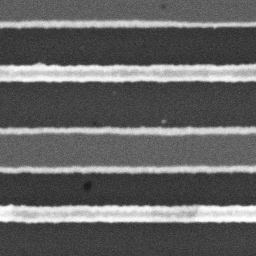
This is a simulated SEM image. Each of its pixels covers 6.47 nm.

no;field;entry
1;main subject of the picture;lines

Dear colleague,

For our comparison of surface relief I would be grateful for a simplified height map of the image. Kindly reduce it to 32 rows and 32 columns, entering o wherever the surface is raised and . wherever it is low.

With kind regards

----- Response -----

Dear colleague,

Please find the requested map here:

oooooooooooooooooooooooooooooooo
oooooooooooooooooooooooooooooooo
oooooooooooooooooooooooooooooooo
................................
................................
................................
................................
................................
oooooooooooooooooooooooooooooooo
oooooooooooooooooooooooooooooooo
................................
................................
................................
................................
................................
................................
oooooooooooooooooooooooooooooooo
oooooooooooooooooooooooooooooooo
oooooooooooooooooooooooooooooooo
oooooooooooooooooooooooooooooooo
oooooooooooooooooooooooooooooooo
................................
................................
................................
................................
................................
oooooooooooooooooooooooooooooooo
oooooooooooooooooooooooooooooooo
................................
................................
................................
................................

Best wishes